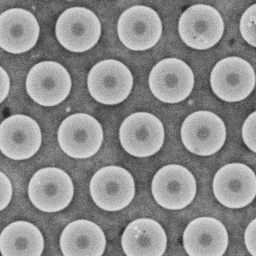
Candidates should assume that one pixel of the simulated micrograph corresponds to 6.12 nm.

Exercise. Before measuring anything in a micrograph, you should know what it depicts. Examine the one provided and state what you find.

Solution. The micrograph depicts an array of small figures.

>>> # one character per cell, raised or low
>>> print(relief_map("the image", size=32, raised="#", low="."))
................................
.###....###.....###....####....#
#####..#####...#####..######..##
#####..######..#####..######..##
#####..#####...#####...#####..##
####....####...####....####....#
.##.............................
....................##......###.
....####....####...#####...####.
#..######..######..#####..######
#..######..######..#####..######
#..######..#####...#####...####.
....####....###.....###.....##..
................................
..#......##.....###.....###....#
#####...####...#####...#####..##
#####..######..#####...#####..##
#####..######..#####...#####..##
#####...####....####...#####...#
.###.....##......##.............
.............................#..
.....###....####....####...#####
#...#####..######..#####...#####
#...#####..######..#####...#####
#...#####..######..#####...#####
#...#####...####....####....###.
................................
.................##.....###.....
.####...####....####...#####...#
#####...#####..######..#####...#
#####...#####..######..#####...#
#####...#####...####...#####...#